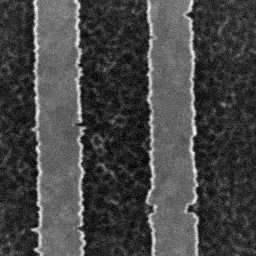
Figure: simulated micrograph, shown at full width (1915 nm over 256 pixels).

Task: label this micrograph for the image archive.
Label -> one or a few lines or trenches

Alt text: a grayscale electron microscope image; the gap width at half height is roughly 529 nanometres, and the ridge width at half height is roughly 318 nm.